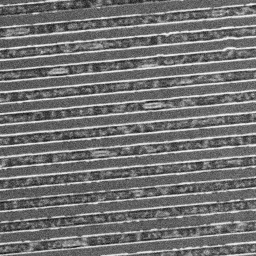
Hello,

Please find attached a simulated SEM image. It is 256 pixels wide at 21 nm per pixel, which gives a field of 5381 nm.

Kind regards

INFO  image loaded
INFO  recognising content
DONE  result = parallel lines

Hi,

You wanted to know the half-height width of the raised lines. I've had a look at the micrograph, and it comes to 225 nm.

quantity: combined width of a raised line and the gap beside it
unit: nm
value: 453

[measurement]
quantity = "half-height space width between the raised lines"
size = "10.7 px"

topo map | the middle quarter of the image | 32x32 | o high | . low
..........................oooooo
................oooooooooooooooo
.....ooooooooooooooooooooooooooo
oooooooooooooooooooooooo........
oooooooooooo....................
oo.............................o
....................oooooooooooo
.........ooooooooooooooooooooooo
.ooooooooooooooooooooooooooo....
ooooooooooooooooo...............
ooooooo.............oooo........
........................oooooooo
.............ooooooooooooooooooo
...ooooooooooooooooooooooooooooo
oooooooooooooooooooooo..........
ooooooooooo.....................
...............................o
..................oooooooooooooo
..........oooooooooooooooooooooo
oooooooooooooooooooooooooo......
ooooooooooooooo.................
oooo............................
........oo...............ooooooo
.............ooooooooooooooooooo
...ooooooooooooooooooooooooooo..
ooooooooooooooooooo.............
ooooooooo.......................
.............................ooo
..................oooooooooooooo
.......ooooooooooooooooooooooooo
oooooooooooooooooooooooo........
ooooooooooooo...................